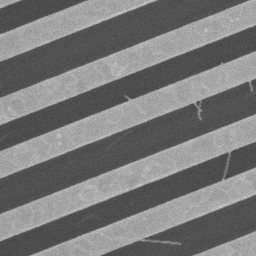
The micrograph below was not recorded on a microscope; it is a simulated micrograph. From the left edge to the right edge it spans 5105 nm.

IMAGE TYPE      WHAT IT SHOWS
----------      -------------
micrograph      lines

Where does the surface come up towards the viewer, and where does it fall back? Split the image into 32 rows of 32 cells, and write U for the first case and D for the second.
UDDDDDDDDDUUUUUUUUDDDDDDDDDDDDUU
DDDDDDDUUUUUUUUUDDDDDDDDDDDDUUUU
DDDDDUUUUUUUUDDDDDDDDDDDDUUUUUUU
DDUUUUUUUUUDDDDDDDDDDDUUUUUUUUUD
UUUUUUUUDDDDDDDDDDDDUUUUUUUUDDDD
UUUUUDDDDDDDDDDDDUUUUUUUUUDDDDDD
UUUDDDDDDDDDDDDUUUUUUUUDDDDDDDDD
DDDDDDDDDDDDUUUUUUUUUDDDDDDDDUUU
DDDDDDDDDDUUUUUUUUDDDDDDDDDUUUUU
DDDDDDDUUUUUUUUUDDDDDDDDUUUUUUUU
DDDDDUUUUUUUUDDDDDDDDDUUUUUUUUDD
DDUUUUUUUUUDDDDDDDDUUUUUUUUUDDDD
UUUUUUUUDDDDDDDDUUUUUUUUUDDDDDDD
UUUUUDDDDDDDDDUUUUUUUUUDDDDDDDDD
UUUDDDDDDDDUUUUUUUUUDDDDDDDDDDDD
DDDDDDDDDUUUUUUUUDDDDDDDDDDDDUUU
DDDDDDUUUUUUUUUDDDDDDDDDDDUUUUUU
DDDDUUUUUUUUDDDDDDDDDDDDUUUUUUUU
DUUUUUUUUUDDDDDDDDDDDUUUUUUUUUDD
UUUUUUUDDDDDDDDDDDDUUUUUUUUDDDDD
UUUUDDDDDDDDDDDDUUUUUUUUUDDDDDDD
UUDDDDDDDDDDDDUUUUUUUUDDDDDDDDDU
DDDDDDDDDDDUUUUUUUUUDDDDDDDDUUUU
DDDDDDDDDUUUUUUUUDDDDDDDDUUUUUUU
DDDDDDUUUUUUUUDDDDDDDDDUUUUUUUUU
DDDUUUUUUUUUDDDDDDDDUUUUUUUUUDDD
DUUUUUUUUDDDDDDDDDUUUUUUUUDDDDDD
UUUUUUUDDDDDDDDUUUUUUUUUDDDDDDDD
UUUUDDDDDDDDDUUUUUUUUDDDDDDDDDDD
UUDDDDDDDDUUUUUUUUUDDDDDDDDDDDDU
DDDDDDDDUUUUUUUUDDDDDDDDDDDDUUUU
DDDDDUUUUUUUUUDDDDDDDDDDDUUUUUUU